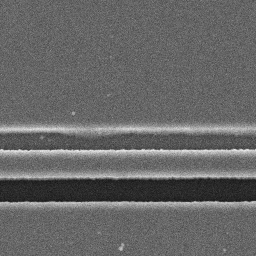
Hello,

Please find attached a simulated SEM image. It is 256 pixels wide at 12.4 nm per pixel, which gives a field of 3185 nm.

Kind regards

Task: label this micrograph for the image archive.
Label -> lines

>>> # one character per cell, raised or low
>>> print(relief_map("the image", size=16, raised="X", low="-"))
XXXXXXXXXXXXXXXX
XXXXXXXXXXXXXXXX
XXXXXXXXXXXXXXXX
XXXXXXXXXXXXXXXX
XXXXXXXXXXXXXXXX
XXXXXXXXXXXXXXXX
XXXXXXXXXXXXXXXX
XXXXXXXXXXXXXXXX
XXXXXXXXXXXXXXXX
XXXXXXXXXXXXXXXX
XXXXXXXXXXXXXXXX
----------------
----------------
XXXXXXXXXXXXXXXX
XXXXXXXXXXXXXXXX
XXXXXXXXXXXXXXXX